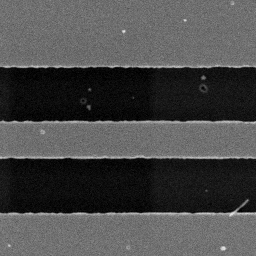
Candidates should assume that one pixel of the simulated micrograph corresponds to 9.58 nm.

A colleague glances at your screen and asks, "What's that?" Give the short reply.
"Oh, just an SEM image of lines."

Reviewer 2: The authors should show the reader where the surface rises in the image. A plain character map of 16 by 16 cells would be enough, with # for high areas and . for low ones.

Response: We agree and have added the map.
################
################
################
################
................
................
................
................
################
################
................
................
................
################
################
################